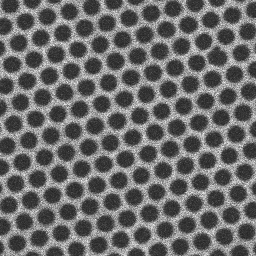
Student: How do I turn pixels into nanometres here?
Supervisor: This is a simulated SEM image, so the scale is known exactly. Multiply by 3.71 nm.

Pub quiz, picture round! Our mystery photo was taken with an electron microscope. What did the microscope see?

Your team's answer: a regular array of holes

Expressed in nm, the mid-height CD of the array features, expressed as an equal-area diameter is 60.8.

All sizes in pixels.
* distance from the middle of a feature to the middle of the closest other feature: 22.3